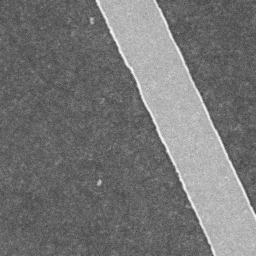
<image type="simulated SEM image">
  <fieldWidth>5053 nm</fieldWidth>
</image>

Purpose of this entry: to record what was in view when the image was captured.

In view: one or a few lines or trenches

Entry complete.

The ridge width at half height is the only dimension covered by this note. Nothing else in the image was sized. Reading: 1.03 um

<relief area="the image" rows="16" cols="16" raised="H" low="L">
LLLLLLHHHHLLLLLL
LLLLLLLHHHLLLLLL
LLLLLLLHHHHLLLLL
LLLLLLLLHHHLLLLL
LLLLLLLLHHHHLLLL
LLLLLLLLLHHHLLLL
LLLLLLLLLHHHHLLL
LLLLLLLLLLHHHLLL
LLLLLLLLLLHHHHLL
LLLLLLLLLLLHHHLL
LLLLLLLLLLLHHHHL
LLLLLLLLLLLHHHHL
LLLLLLLLLLLLHHHL
LLLLLLLLLLLLHHHH
LLLLLLLLLLLLLHHH
LLLLLLLLLLLLLHHH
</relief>